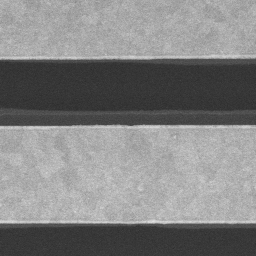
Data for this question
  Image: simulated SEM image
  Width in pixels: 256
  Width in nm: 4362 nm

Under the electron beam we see lines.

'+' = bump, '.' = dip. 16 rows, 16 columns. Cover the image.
++++++++++++++++
++++++++++++++++
++++++++++++++++
++++++++++++++++
................
................
................
................
++++++++++++++++
++++++++++++++++
++++++++++++++++
++++++++++++++++
++++++++++++++++
++++++++++++++++
................
................